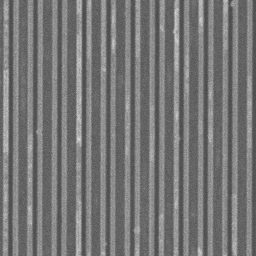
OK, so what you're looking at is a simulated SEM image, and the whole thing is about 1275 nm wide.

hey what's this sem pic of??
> parallel lines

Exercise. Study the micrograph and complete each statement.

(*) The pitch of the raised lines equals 60.6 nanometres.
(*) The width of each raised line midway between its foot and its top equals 0.0249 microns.